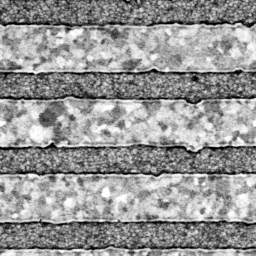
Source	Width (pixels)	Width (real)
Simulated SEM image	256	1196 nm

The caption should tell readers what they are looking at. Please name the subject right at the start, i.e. one or a few lines or trenches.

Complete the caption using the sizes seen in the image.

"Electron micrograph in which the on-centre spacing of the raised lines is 349 nm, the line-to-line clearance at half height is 134 nm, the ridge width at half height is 210 nm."